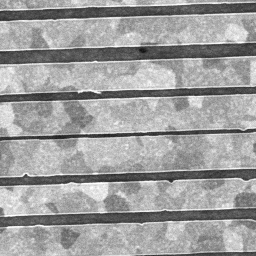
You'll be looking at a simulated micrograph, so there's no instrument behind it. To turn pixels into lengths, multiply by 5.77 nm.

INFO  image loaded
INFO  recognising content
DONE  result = parallel lines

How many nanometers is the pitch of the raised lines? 239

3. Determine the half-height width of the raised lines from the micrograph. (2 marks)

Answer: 172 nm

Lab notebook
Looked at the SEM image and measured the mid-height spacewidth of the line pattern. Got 64.2 nm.